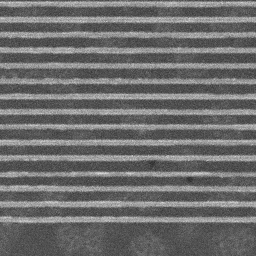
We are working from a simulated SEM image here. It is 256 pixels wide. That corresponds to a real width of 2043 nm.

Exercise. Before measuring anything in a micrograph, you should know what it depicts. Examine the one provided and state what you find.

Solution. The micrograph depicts parallel lines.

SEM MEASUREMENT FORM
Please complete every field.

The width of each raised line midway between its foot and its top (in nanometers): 33.9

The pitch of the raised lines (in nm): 123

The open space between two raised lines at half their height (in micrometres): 0.0888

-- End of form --